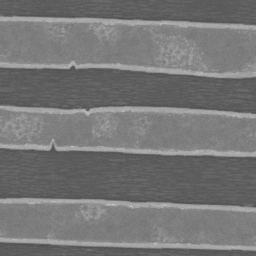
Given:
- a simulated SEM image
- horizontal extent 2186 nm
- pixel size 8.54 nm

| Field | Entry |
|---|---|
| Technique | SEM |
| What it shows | one or a few lines or trenches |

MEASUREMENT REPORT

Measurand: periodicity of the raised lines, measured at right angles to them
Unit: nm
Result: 762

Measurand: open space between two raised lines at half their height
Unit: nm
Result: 410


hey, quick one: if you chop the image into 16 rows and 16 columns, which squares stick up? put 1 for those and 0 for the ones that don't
0000000000000000
1111111111100000
1111111111111111
1111111111111111
0000000000011111
0000000000000000
0000000000000000
1111111111111111
1111111111111111
0000000000111111
0000000000000000
0000000000000000
0000000000000000
1111111111111111
1111111111111111
0000000000000000